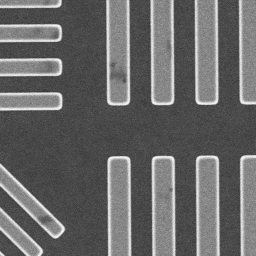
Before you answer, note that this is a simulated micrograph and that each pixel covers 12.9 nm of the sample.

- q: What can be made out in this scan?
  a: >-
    groups of lines, slits or small figures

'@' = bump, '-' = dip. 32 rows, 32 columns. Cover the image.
@@@@@@@------@@@---@@@--@@@---@@
-------------@@@---@@@--@@@---@@
-------------@@@---@@@--@@@---@@
@@@@@@@------@@@---@@@--@@@---@@
@@@@@@@@-----@@@---@@@--@@@---@@
-------------@@@---@@@--@@@---@@
-------------@@@---@@@--@@@---@@
@@@@@@@------@@@---@@@--@@@---@@
@@@@@@@@-----@@@---@@@--@@@---@@
-------------@@@---@@@---@@---@@
-------------@@@---@@@---@@---@@
--------------@@---@@@---@@---@@
@@@@@@@@------@@---@@@---@@---@@
@@@@@@@-------------------------
--------------------------------
--------------------------------
--------------------------------
--------------------------------
--------------------------------
--------------------------------
--------------@@---@@@---@@---@@
@-------------@@---@@@---@@---@@
@@------------@@---@@@---@@---@@
@@@-----------@@---@@@---@@---@@
-@@@----------@@---@@@---@@---@@
--@@@---------@@---@@@---@@---@@
@--@@@--------@@---@@@---@@---@@
@@--@@@-------@@---@@@---@@---@@
@@@--@@@------@@---@@@---@@---@@
-@@@----------@@---@@@---@@---@@
--@@@---------@@---@@@---@@---@@
---@@---------@@---@@@---@@---@@